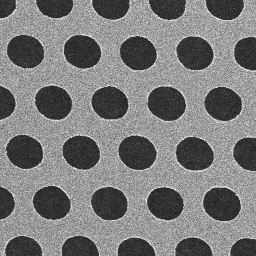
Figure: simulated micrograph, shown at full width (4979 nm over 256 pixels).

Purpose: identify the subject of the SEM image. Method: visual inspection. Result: a regular array of holes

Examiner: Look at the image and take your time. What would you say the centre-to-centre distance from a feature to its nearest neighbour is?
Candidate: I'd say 1100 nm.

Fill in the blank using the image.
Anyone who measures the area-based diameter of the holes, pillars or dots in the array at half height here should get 693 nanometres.